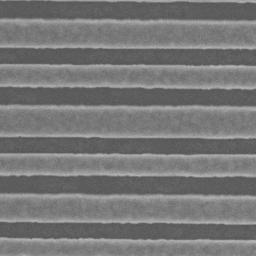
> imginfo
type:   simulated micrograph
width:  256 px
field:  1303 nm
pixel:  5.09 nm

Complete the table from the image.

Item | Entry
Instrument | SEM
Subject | lines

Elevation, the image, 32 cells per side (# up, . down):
................................
................................
................................
################################
################################
################################
................................
................................
################################
################################
################################
................................
................................
################################
################################
################################
################################
................................
................................
################################
################################
################################
................................
................................
############..###.#######.......
################################
################################
################################
................................
................................
################################
################################